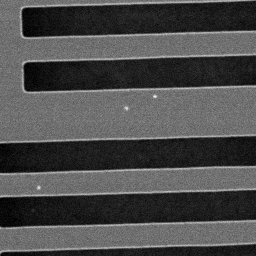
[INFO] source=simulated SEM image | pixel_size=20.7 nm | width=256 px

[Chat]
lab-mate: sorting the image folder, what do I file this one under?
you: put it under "groups of lines, slits or small figures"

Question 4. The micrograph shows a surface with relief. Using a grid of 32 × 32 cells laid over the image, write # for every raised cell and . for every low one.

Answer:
#############...................
###.............................
###.............................
###.............................
###..........###################
################################
################################
##########......................
###.............................
###.............................
###.............................
####.###########################
################################
################################
################################
################################
################################
############....................
................................
................................
................................
........########################
################################
################################
###.............................
................................
................................
................................
################################
################################
##############################..
................................